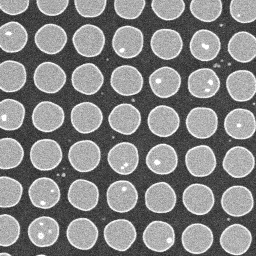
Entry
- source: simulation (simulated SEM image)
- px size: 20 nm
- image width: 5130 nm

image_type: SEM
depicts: an array of small figures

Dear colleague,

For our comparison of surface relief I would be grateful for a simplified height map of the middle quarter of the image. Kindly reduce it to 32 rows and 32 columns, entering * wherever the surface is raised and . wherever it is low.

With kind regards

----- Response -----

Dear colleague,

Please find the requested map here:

....****........................
...******....*****.....****.....
..*******...*******...*******...
..********..*******...*******..*
..********..********.********..*
..*******...*******...*******..*
....****.....******...******...*
......*.......***......****.....
................................
................................
...*****.....****...............
..*******...******....*****.....
..*******...*******..*******...*
..*******..********..********..*
..*******..********..********..*
..*******...*******..********..*
...*****.....*****....******...*
.......................****.....
................................
....***.........................
..******.....****......***......
.********...******....*****....*
.********..*******...*******...*
.********..*******...*******...*
..*******..*******...*******..**
..******....******...*******...*
...****......****.....*****....*
................................
................................
..*****......***................
..******....*****.....****.....*
.*******...*******...******...**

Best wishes